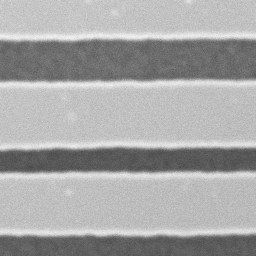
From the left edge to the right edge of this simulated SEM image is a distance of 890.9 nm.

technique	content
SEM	lines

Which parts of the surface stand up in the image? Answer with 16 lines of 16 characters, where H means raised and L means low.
HHHHHHHHHHHHHHHH
HHHHHHHHHHHHHHHH
LLLHHLLLLLLLLLLL
LLLLLLLLLLLLLLLL
LLLLLLLLLLLLLLLL
HHHHHHHHHHHHHHHH
HHHHHHHHHHHHHHHH
HHHHHHHHHHHHHHHH
HHHHHHHHHHHHHHHH
LLLLLLLLLLLLLLLL
LLLLLLLLLLLLLLLL
HHHHHHHHHHHHHHHH
HHHHHHHHHHHHHHHH
HHHHHHHHHHHHHHHH
HHHHHHHHHHHHHHHH
LLLLLLLLLLLLLLLL